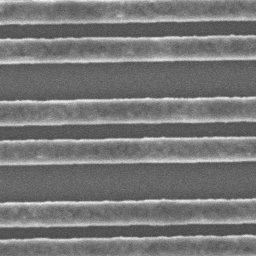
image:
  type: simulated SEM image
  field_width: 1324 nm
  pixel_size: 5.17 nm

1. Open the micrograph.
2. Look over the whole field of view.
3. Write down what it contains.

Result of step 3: lines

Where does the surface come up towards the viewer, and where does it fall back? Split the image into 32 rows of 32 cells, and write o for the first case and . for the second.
oooooooooooooooooooooooooooooooo
oooooooooooooooooooooooooooooooo
ooooooooooooooooooooooooo.......
................................
.............................o..
oooooooooooooooooooooooooooooooo
oooooooooooooooooooooooooooooooo
ooooooooooooooo.................
................................
................................
................................
................................
...............ooooooooooooooooo
oooooooooooooooooooooooooooooooo
oooooooooooooooooooooooooooooooo
oo..............................
................................
.............ooooooooooooooooooo
oooooooooooooooooooooooooooooooo
oooooooooooooooooooooooooooooooo
................................
................................
................................
................................
................................
oooooooooooooooooooooooooooooooo
oooooooooooooooooooooooooooooooo
oooooooooooooooooooooooooooooooo
................................
..............................o.
oooooooooooooooooooooooooooooooo
oooooooooooooooooooooooooooooooo